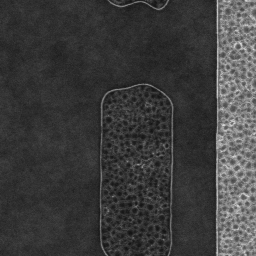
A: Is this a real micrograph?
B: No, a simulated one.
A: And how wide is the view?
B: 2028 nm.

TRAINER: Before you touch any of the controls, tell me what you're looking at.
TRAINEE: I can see one or a few lines or trenches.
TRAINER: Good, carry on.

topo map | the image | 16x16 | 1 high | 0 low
0000000000000011
0000000000000011
0000000000000011
0000000000000011
0000000000000011
0000000011000011
0000001111100011
0000001111100011
0000001111100011
0000001111100011
0000001111100011
0000001111100011
0000001111100011
0000001111100011
0000001111100011
0000001111100011